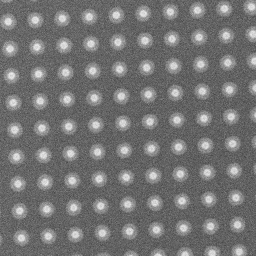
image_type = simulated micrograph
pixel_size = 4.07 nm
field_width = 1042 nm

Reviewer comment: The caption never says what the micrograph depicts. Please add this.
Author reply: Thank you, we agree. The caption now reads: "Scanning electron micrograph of an array of small figures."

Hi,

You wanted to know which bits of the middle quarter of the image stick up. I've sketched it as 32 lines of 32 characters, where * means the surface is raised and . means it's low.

*.....***...****...***....***...
**...****...****...***....***...
**...****...***.....**..........
**....**........................
................................
...........................**...
.............***....***...****..
**....***....***...****...****..
***...***...****...****...***...
***...***....***....**..........
**..............................
................................
...........................**...
.......**....***....***...****..
***...****...****...***...****..
***...****...****...***....**...
***....**.....**................
.*..............................
................................
.....................**....***..
.......***....***...****...****.
***...****...****...****...***..
***...****...****....**.....**..
***....**.......................
................................
................................
.....................***...****.
.**....***....***...****...****.
****...****...***...****...****.
****...****...***....**.........
.**.....**......................
................................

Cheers